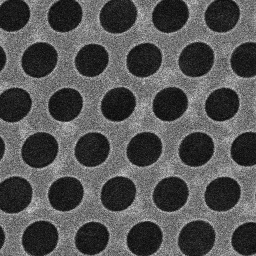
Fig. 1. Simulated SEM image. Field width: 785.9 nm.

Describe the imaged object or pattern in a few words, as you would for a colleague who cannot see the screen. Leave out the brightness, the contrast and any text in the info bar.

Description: a regular array of holes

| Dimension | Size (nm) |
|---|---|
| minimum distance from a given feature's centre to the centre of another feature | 158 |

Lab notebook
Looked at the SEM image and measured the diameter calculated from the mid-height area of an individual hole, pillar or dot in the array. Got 0.107 microns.